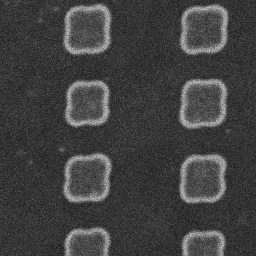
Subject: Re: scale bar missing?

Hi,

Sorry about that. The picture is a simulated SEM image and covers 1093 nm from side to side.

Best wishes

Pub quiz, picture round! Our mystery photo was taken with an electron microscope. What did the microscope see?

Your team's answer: raised bodies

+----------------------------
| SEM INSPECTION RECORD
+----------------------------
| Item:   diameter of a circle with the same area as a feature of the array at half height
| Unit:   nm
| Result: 198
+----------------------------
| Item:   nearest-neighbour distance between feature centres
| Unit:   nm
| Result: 316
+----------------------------